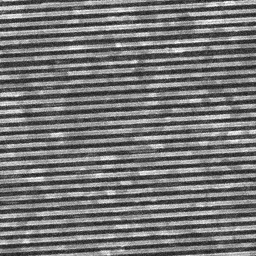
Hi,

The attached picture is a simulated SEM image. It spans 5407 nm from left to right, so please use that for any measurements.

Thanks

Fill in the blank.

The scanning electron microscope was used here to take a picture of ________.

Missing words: parallel lines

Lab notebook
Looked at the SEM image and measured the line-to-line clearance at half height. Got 0.116 micrometres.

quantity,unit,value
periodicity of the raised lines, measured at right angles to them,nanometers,183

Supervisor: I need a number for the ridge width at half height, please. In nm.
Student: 76.4